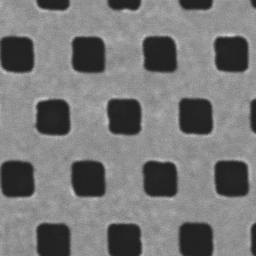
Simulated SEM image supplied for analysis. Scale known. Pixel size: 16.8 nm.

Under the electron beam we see a regular array of holes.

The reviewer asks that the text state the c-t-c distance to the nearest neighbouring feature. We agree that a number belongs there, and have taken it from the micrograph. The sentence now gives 1190 nm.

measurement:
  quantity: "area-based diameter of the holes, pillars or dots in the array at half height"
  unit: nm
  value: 658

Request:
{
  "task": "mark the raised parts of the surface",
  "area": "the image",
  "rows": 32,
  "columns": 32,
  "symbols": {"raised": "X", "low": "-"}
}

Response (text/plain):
XXXXX----XXXX-----XXXX-----XXXX-
XXXXXXXXXXXXXXXXXXXXXXXXXXXXXXXX
XXXXXXXXXXXXXXXXXXXXXXXXXXXXXXXX
XXXXXXXXXXXXXXXXXXXXXXXXXXXXXXXX
X--XXXXXXXXXXXXXXXX--XXXXXX---XX
----XXXXX----XXXXX----XXXXX----X
----XXXXX----XXXXX----XXXXX----X
----XXXXX----XXXXX----XXXXX----X
----XXXXX----XXXXX----XXXXX----X
XXXXXXXXXXXXXXXXXXXXXXXXXXXXXXXX
XXXXXXXXXXXXXXXXXXXXXXXXXXXXXXXX
XXXXXXXXXXXXXXXXXXXXXXXXXXXXXXXX
XXXXXX--XXXXXX---XXXXXX---XXXXXX
XXXXX----XXXX-----XXXX-----XXXX-
XXXX-----XXXX-----XXXX-----XXXX-
XXXX-----XXXX-----XXXX-----XXXX-
XXXXX----XXXXX---XXXXXX---XXXXXX
XXXXXXXXXXXXXXXXXXXXXXXXXXXXXXXX
XXXXXXXXXXXXXXXXXXXXXXXXXXXXXXXX
XXXXXXXXXXXXXXXXXXXXXXXXXXXXXXXX
----XXXXX----XXXXX----XXXXX----X
----XXXXX----XXXXX----XXXXX----X
----XXXXX----XXXXX----XXXXX----X
----XXXXX----XXXXX----XXXXX----X
X---XXXXXX---XXXXXX---XXXXXX---X
XXXXXXXXXXXXXXXXXXXXXXXXXXXXXXXX
XXXXXXXXXXXXXXXXXXXXXXXXXXXXXXXX
XXXXXXXXXXXXXXXXXXXXXXXXXXXXXXXX
XXXXX----XXXX----XXXXX----XXXXX-
XXXX-----XXXX-----XXXX-----XXXX-
XXXX-----XXXX-----XXXX-----XXXX-
XXXXX----XXXXX----XXXX-----XXXX-